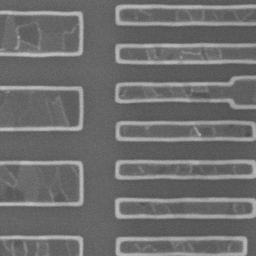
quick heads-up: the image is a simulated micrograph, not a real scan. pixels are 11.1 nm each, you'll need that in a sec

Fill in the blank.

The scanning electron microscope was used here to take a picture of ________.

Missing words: wiring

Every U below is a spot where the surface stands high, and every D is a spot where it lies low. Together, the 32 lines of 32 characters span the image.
DDDDDDDDDDDDDDDDDDDDDDDDDDDDDDDD
DDDDDDDDDDDDDDDUUUUUUUUUUUUUUUUU
UUUUUUUUUUDDDDDUUUUUUUUUUUUUUUUU
UUUUUUUUUUDDDDDDDDDDDDDDDDDDDDDD
UUUUUUUUUUDDDDDDDDDDDDDDDDDDDDDD
UUUUUUUUUUDDDDDDDDDDDDDDDDDDDDDD
UUUUUUUUUUDDDDDUUUUUUUUUUUUUUUUU
DDDDDDDDDDDDDDDUUUUUUUUUUUUUUUUU
DDDDDDDDDDDDDDDDDDDDDDDDDDDDDDDD
DDDDDDDDDDDDDDDDDDDDDDDDDDDDDDDD
DDDDDDDDDDDDDDDDDDDDDDDDDDDDUUUU
UUUUUUUUUUDDDDDUUUUUUUUUUUUUUUUU
UUUUUUUUUUDDDDDUUUUUDDDUUUUUUUUU
UUUUUUUUUUDDDDDDDDDDDDDDDDDDDDDD
UUUUUUUUUUDDDDDDDDDDDDDDDDDDDDDD
UUUUUUUUUUDDDDDUUUUUUUUUUUUUUUUD
DDDDDDDDDDDDDDDUUUUUUUUUUUUUUUUU
DDDDDDDDDDDDDDDDDDDDDDDDDDDDDDDD
DDDDDDDDDDDDDDDDDDDDDDDDDDDDDDDD
DDDDDDDDDDDDDDDDDDDDDDDDDDDDDDDD
UUUUUUUUUUDDDDDUUUUUUUUUUUUUUUUU
UUUUUUUUUUDDDDDUUUUUUUUUUUUUUUUU
UUUUUUUUUUDDDDDDDDDDDDDDDDDDDDDD
UUUUUUUUUUDDDDDDDDDDDDDDDDDDDDDD
UUUUUUUUUUDDDDDDDDDDDDDDDDDDDDDD
DDDDDDDDDDDDDDDUUUUUUUUUUUUUUUUU
DDDDDDDDDDDDDDDUUUUUUUUUUUUUUUUU
DDDDDDDDDDDDDDDDDDDDDDDDDDDDDDDD
DDDDDDDDDDDDDDDDDDDDDDDDDDDDDDDD
DDDDDDDDDDDDDDDDDDDDDDDDDDDDDDDD
UUUUUUUUUUDDDDDUUUUUUUUUUUUUUUUD
UUUUUUUUUUDDDDDUUUUUUUUUUUUUUUDD